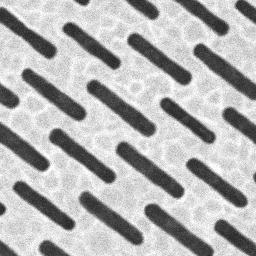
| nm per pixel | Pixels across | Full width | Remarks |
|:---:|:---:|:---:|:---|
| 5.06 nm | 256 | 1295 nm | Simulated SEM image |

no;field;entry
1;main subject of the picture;a regular array of holes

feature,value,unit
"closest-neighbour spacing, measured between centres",0.315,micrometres